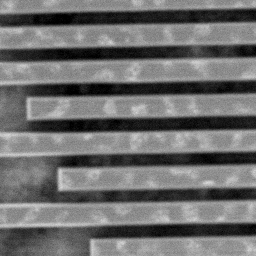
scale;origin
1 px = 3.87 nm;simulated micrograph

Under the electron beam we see parallel lines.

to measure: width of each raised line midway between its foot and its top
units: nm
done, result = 80.8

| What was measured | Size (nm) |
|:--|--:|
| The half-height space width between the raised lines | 56.1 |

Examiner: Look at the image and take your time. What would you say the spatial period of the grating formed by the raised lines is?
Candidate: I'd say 138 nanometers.